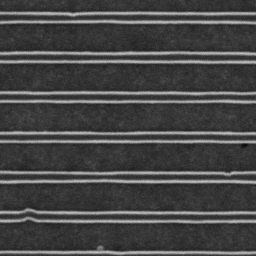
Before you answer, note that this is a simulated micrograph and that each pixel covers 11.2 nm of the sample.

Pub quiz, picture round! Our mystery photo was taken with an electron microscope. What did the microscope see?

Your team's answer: parallel lines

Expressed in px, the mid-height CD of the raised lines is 9.12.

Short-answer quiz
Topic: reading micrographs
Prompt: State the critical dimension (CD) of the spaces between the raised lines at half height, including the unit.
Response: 0.348 µm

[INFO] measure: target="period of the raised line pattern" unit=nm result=446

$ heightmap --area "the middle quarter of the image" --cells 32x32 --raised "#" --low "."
................................
................................
................................
................................
................................
................................
................................
################################
################################
................................
................................
................................
................................
................................
................................
................................
................................
################################
################################
................................
................................
................................
................................
................................
................................
................................
................................
################################
################################
................................
................................
................................